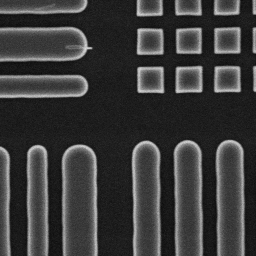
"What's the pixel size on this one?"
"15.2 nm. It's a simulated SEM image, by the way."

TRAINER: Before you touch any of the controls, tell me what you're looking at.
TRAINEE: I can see groups of lines, slits or small figures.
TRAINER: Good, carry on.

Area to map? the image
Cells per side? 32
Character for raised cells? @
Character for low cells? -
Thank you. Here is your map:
@@@@@@@@@@@------@@@--@@@--@@@--
@@@@@@@@---------@@@--@@@--@@@--
--------------------------------
--------------------------------
@@@@@@@@@@-------@@@--@@@--@@@--
@@@@@@@@@@@------@@@--@@@--@@@--
@@@@@@@@@@@------@@@--@@@--@@@--
@@@@@@@@------------------------
------------------@@--@@@--@@@--
-----------------@@@--@@@--@@@--
@@@@@@@@@@@------@@@--@@@--@@@--
@@@@@@@@@@@---------------------
--------------------------------
--------------------------------
--------------------------------
--------------------------------
--------------------------------
--------------------------------
----@----@@------@@@--@@@--@@@--
@---@@--@@@@-----@@@--@@@--@@@--
@---@@--@@@@-----@@@--@@@--@@@--
@---@@--@@@@-----@@@--@@@--@@@--
@---@@--@@@@-----@@@--@@@--@@@--
@---@@--@@@@-----@@@--@@@--@@@--
@---@@--@@@@-----@@@--@@@--@@@--
@---@@--@@@@-----@@@--@@@--@@@--
@---@@--@@@@-----@@@--@@@--@@@--
@---@@--@@@@-----@@@--@@@--@@@--
@---@@--@@@@-----@@@--@@@--@@@--
@---@@--@@@@-----@@@--@@@--@@@--
@---@@--@@@@-----@@@--@@@--@@@--
@---@@--@@@@-----@@@--@@@--@@@--